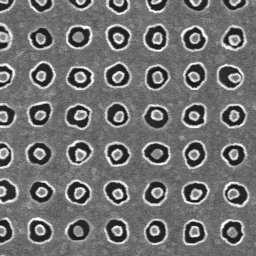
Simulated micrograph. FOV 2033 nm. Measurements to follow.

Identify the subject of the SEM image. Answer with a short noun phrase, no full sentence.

a regular array of ring-shaped grooves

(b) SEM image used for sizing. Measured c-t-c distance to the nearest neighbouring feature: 298 nm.